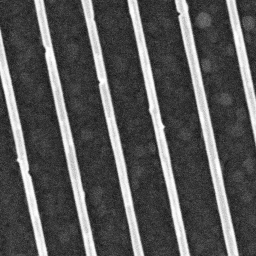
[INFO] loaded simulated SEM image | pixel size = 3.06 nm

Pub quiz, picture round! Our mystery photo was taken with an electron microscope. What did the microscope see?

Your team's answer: parallel lines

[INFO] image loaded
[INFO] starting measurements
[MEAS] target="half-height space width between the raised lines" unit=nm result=121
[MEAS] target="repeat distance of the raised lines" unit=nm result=143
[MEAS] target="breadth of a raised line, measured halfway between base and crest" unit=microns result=0.024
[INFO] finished